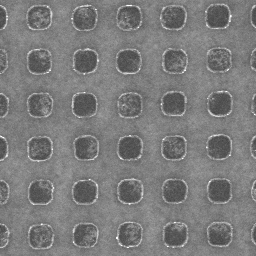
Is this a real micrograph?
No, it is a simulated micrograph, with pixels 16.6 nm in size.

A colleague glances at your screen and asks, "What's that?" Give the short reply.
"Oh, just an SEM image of a regular array of raised bodies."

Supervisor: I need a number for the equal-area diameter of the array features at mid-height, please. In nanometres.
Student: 432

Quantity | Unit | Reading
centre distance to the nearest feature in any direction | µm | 0.719